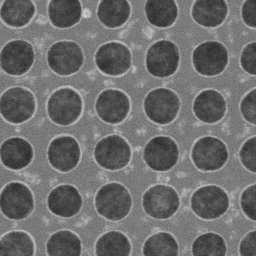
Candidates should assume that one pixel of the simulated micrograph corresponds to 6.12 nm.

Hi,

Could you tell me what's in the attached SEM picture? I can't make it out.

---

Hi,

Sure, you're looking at a regular array of holes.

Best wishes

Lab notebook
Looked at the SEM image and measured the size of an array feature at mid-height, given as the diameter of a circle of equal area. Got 0.22 micrometres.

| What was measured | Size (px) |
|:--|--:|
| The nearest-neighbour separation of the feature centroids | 47.7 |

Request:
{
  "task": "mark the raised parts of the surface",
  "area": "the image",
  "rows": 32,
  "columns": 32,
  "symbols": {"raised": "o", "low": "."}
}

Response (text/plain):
....oo....oo....oo....oo....oo..
....oo....oo....oo....oo....oo..
....oo....oo....oo....oo....oo..
ooooooo.oooooooooooooooooooooooo
oooooooooooooooooooooooooooooooo
o...ooo...ooo..oooo...ooo...ooo.
....oo....oo....oo....oo....oo..
....oo....oo....oo....oo....oo..
....oo....oo....oo....oo....oo..
ooooooooooooooooooo..ooooooooooo
oooooooooooooooooooooooooooooooo
o...ooo..oooo..oooo...ooo..oooo.
....oo....oo....oo....oo....oo..
....oo....oo....oo....oo....oo..
....oo....oo....oo....ooo...oo..
ooooooo..ooooo.ooooo.ooooooooooo
oooooooooooooooooooooooooooooooo
o..oooo..ooo....ooo...ooo..oooo.
....oo....oo....oo....oo....oo..
....oo....oo....oo....oo....oo..
....oo....oo....oo....oo....oo..
oooooooooooooooooooooooooooooooo
oooooooooooooooooooooooooooooooo
....ooo..oooo...ooo...ooo...ooo.
....oo....oo....oo....oo....oo..
....oo....oo....oo....oo.....o..
....oo....oo....oo....oo....oo..
oooooooooooooo.ooooooooooooooooo
oooooooooooooooooooooooooooooooo
o...oo....ooo...ooo...ooo..oooo.
....oo....oo....oo....oo....oo..
....oo....oo....oo....oo....oo..